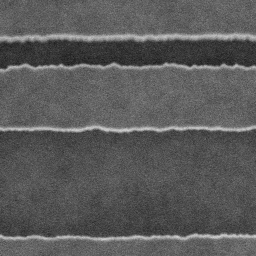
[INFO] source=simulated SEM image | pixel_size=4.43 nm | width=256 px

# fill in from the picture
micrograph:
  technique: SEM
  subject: lines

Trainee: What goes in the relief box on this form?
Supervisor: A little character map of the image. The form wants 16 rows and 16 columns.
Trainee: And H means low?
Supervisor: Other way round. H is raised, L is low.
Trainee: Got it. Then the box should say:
HHHHHHHHHHHHHHHH
HHHHHHHHHHHHHHHH
LLLLLLLLLLLLLLLL
LLLLLLLLLLLLLLLL
HHHHHHHHHHHHHHHH
HHHHHHHHHHHHHHHH
HHHHHHHHHHHHHHHH
HHHHHHHHHHHHHHHH
LLLLLLLLLLLLLLLL
LLLLLLLLLLLLLLLL
LLLLLLLLLLLLLLLL
LLLLLLLLLLLLLLLL
LLLLLLLLLLLLLLLL
LLLLLLLLLLLLLLLL
LLLLLLLLLLLLLLLL
HHHHHHHHHHHHHHHH